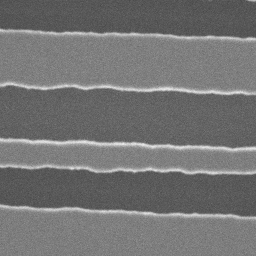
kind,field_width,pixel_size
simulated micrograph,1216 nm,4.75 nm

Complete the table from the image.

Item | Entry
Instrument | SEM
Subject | lines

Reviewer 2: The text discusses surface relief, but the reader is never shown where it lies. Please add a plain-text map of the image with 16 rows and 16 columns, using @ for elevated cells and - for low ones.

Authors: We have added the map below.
----------------
----------------
@@@@@@@@@@@@@@@@
@@@@@@@@@@@@@@@@
@@@@@@@@@@@@@@@@
--@@-@-@@@@@@@@@
----------------
----------------
----------------
@@@@@@@@@@@@@@@@
-@@@@@@@@@@@@@@@
----------------
----------------
@@@@@@@@@@@@@@@-
@@@@@@@@@@@@@@@@
@@@@@@@@@@@@@@@@